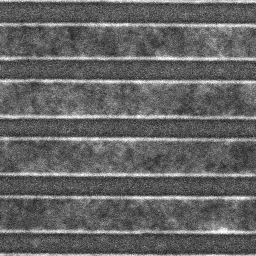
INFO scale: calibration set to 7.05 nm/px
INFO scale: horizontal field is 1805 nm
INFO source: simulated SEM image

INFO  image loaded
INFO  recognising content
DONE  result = parallel lines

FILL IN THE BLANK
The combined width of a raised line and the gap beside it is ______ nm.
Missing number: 407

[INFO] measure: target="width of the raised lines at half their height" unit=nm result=249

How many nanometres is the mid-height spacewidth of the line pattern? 155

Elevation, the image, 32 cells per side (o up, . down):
................................
................................
................................
oooooooooooooooooooooooooooooooo
oooooooooooooooooooooooooooooooo
oooooooooooooooooooooooooooooooo
oooooooooooooooooooooooooooooooo
................................
................................
................................
oooooooooooooooooooooooooooooooo
oooooooooooooooooooooooooooooooo
oooooooooooooooooooooooooooooooo
oooooooooooooooooooooooooooooooo
oooooooooooooooooooooooooooooooo
................................
................................
oooooooooooooooooooooo.......oo.
oooooooooooooooooooooooooooooooo
oooooooooooooooooooooooooooooooo
oooooooooooooooooooooooooooooooo
oooooooooooooooooooooooooooooooo
................................
................................
................................
oooooooooooooooooooooooooooooooo
oooooooooooooooooooooooooooooooo
oooooooooooooooooooooooooooooooo
oooooooooooooooooooooooooooooooo
................................
................................
................................